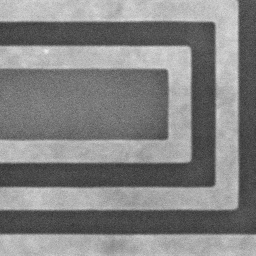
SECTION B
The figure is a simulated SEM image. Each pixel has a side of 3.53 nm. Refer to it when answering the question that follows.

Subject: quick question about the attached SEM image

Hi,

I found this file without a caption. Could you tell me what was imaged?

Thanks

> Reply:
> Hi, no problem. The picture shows groups of lines, slits or small figures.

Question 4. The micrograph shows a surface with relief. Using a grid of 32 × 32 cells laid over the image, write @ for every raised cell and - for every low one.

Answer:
@@@@@@@@@@@@@@@@@@@@@@@@@@@@@@--
@@@@@@@@@@@@@@@@@@@@@@@@@@@@@@--
@@@@@@@@@@@@@@@@@@@@@@@@@@@@@@--
---------------------------@@@--
---------------------------@@@--
---------------------------@@@--
@@@@@@@@@@@@@@@@@@@@@@@@---@@@--
@@@@@@@@@@@@@@@@@@@@@@@@---@@@--
--------------------@@@@---@@@--
---------------------@@@---@@@--
---------------------@@@---@@@--
---------------------@@@---@@@--
---------------------@@@---@@@--
---------------------@@@---@@@--
---------------------@@@---@@@--
---------------------@@@---@@@--
---------------------@@@---@@@--
---------------------@@@---@@@--
@@@@@@@@@@@@@@@@@@@@@@@@---@@@--
@@@@@@@@@@@@@@@@@@@@@@@@---@@@--
---------------------------@@@--
---------------------------@@@--
---------------------------@@@--
------------------@-------@@@@--
@@@@@@@@@@@@@@@@@@@@@@@@@@@@@@--
@@@@@@@@@@@@@@@@@@@@@@@@@@@@@@--
--------------------------------
--------------------------------
--------------------------------
@@@@@@@@@@@@@@@@@@@@@@@@@@@@@@@@
@@@@@@@@@@@@@@@@@@@@@@@@@@@@@@@@
@@@@@@@@@@@@@@@@@@@@@@@@@@@@@@@@